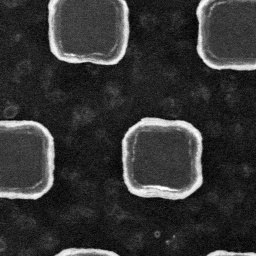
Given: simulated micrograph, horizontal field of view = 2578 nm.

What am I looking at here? raised bodies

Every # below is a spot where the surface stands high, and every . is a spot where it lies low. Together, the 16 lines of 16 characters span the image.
...#####....####
...#####....####
...#####....####
....####.....###
................
................
................
................
###.....####....
###.....#####...
###.....####....
###.....####....
................
................
................
................